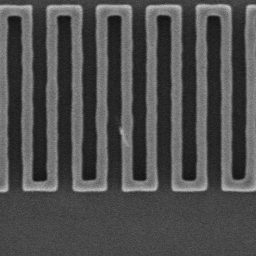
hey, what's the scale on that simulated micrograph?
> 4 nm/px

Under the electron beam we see groups of lines, slits or small figures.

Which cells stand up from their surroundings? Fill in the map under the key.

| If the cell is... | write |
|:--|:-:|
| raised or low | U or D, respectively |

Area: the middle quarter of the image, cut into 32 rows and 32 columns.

DDUUDDDDUUUDDDUUUDDDDUUDDDDUUDDD
DDUUDDDDUUUDDDUUUDDDDUUDDDDUUDDD
DDUUDDDDUUUDDDUUUDDDDUUDDDDUUDDD
DDUUDDDDUUUDDDUUUDDDDUUDDDDUUDDD
DDUUDDDDUUUDDDUUUDDDDUUDDDDUUDDD
DDUUDDDDUUUDDDUUUDDDDUUDDDDUUDDD
DDUUDDDDUUUDDDUUUDDDDUUDDDDUUDDD
DDUUDDDDUUUDDDDUUDDDDUUDDDDUUDDD
DDUUDDDDUUUDDDDUUDDDDUUDDDDUUDDD
DDUUDDDDUUUDDDDUUDDDDUUDDDDUUDDD
DDUUDDDDUUUDDDDUUDDDDUUDDDDUUDDD
DDUUDDDDUUUDDDDUUDDDDUUDDDDUUDDD
DDUUDDDDUUUDDDUUUDDDDUUDDDDUUDDD
DDUUDDDDUUUDDDUUUDDDDUUDDDDUUDDD
DDUUDDDDUUUDDDUUUDDDDUUDDDDUUDDD
DDUUDDDDUUUDDDUUUDDDDUUDDDDUUDDD
DDUUDDDDUUUDDDUUUDDDDUUDDDDUUDDD
DDUUDDDDUUUDDDUUUDDDDUUDDDDUUDDD
DDUUDDDDUUUDDDUUUDDDDUUDDDDUUDDD
DDUUDDDDUUUDDDUUUDDDDUUDDDDUUDDD
DDUUDDDDUUUDDDDUUDDDDUUDDDDUUDDD
DDUUDDDDUUUDDDDUUDDDDUUDDDDUUDDD
DDUUDDDDUUUDDDDUUDDDDUUDDDDUUDDD
DDUUDDDDUUUDDDDUUDDDDUUDDDDUUDDD
DDUUDDDDUUUDDDDUUDDDDUUDDDDUUDDD
DDUUDDDDUUUDDDDUUDDDDUUDDDDUUDDD
DDUUDDDDUUUDDDDUUDDDDUUDDDDUUDDD
DDUUDDDDUUUDDDDUUDDDDUUDDDDUUDDD
DDUUDDDDUUUDDDDUUDDDDUUDDDDUUDDD
DDUUUUUUUUUDDDDUUUUDUUUDDDDUUUUU
DDUUUUUUUUUDDDDUUUUUUUUDDDDUUUUU
DDDUUUUUUUDDDDDUUUUUUUUDDDDUUUUU